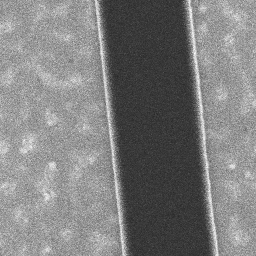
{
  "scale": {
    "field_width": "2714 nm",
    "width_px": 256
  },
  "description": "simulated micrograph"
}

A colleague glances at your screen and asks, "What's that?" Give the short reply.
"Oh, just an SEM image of one or a few lines or trenches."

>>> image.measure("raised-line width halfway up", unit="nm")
993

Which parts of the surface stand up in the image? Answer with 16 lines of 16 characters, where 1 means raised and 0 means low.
0000001111110000
0000001111110000
0000001111110000
0000001111110000
0000001111110000
0000000111110000
0000000111111000
0000000111111000
0000000111111000
0000000111111000
0000000111111000
0000000111111000
0000000111111000
0000000111111000
0000000011111000
0000000011111100